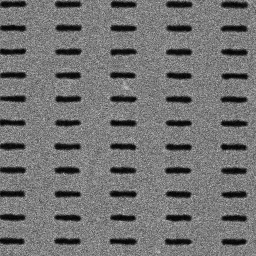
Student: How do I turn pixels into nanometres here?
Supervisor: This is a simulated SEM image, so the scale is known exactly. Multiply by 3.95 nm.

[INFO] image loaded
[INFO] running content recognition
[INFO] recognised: a regular array of holes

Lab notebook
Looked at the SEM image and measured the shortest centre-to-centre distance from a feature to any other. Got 93.1 nm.